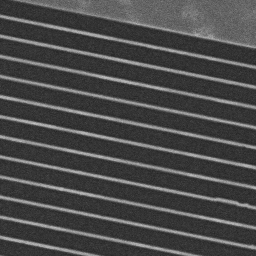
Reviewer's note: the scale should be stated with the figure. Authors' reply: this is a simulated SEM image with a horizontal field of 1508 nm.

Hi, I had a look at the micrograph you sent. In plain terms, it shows parallel lines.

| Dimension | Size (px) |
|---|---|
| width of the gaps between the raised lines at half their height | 16.5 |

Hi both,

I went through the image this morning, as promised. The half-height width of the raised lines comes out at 20.2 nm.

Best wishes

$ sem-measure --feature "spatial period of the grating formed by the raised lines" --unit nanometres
116